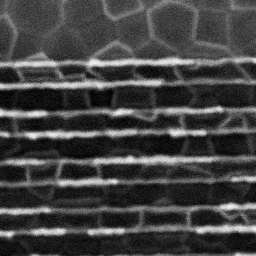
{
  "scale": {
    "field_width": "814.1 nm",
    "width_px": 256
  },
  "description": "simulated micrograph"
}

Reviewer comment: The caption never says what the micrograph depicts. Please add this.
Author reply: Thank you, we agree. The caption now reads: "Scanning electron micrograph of parallel lines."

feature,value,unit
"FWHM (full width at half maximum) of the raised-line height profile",82.8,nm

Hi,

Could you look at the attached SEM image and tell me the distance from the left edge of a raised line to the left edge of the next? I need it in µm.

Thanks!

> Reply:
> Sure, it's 0.156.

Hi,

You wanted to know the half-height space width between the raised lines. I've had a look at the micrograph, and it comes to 74.4 nm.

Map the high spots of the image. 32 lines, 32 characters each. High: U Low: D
DDDDDDDDDDDDDDDDDDDDDDDDDDDDDDDD
DDDDDDDDDDDDDDDDDDDDDDDDDDDDDDDD
DDDDDDDDDDDDDDDDDDDDDDDDDDDDDDDD
DDDDDDDDDDDDDDDDDDDDDDDDDDDDDDDD
DDDDDDDDDDDDDDDDDDDDDDDDDDDDDDDD
DDDDDDDDDDDDDDDDDDDDDDDDDDDDDDDD
DDDDDDDDDDDDDDDDDDDDDDDDDDDDDDDD
DDDDDDDDDDDDDDDUUUDDUUUUUUDUUUUU
UUUUUUUUUUUUUUUUUUUUUUUUUUUUUUUU
UUUUUUUUUUUUUUUUUUUUUUUUUUUUUUUU
UUUUUUUUUUUUUUUUUUUUUUUDDDUDDDDD
DDDDDDDDDDDDDDDDDDDDDDDDDDDDDDDD
DDDDDDDDDDDDDDDDDDDDDDDDDDDDDDDD
DDDDDDDDDDDDDDDDDDDDDUDDDDUUDDDU
UUUUUUUUUUUUUUUUUUUUUUUUUUUUUUUU
UUUUUUUUUUUUUUUUUUUUUUUUUUUUUUUU
UUUUUUUUUUUUUUUUUUUUUUUUUUUUUUUU
DDDDDDDDDDDDDDDDDDDDDDDDDDDDDDDD
DDDDDDDDDDDDDDDDDDDDDDDDDDDDDDDD
DDDDDDDDDDDDDDDDDDDUUDDDDDDDDDDD
UUUUUUUUUUUUUUUUUUUUUUUUUUUUUUUU
UUUUUUUUUUUUUUUUUUUUUUUUUUUUUUUU
UUUUUUUUUUUUUUUUUUUUUUUUUUUUUUUU
DDDDDDDDDDDDDDDDDDDDDDDDDDDDDDDD
DDDDDDDDDDDDDDDDDDDDDDDDDDDDDDDD
DDDDDDDDDDDDDDDDDDDDDDDDDDDDUDDU
UUUUUUUUUUUUUUUUUUUUUUUUUUUUUUUU
UUUUUUUUUUUUUUUUUUUUUUUUUUUUUUUU
UUUUUUUUUUUUUUUUUUUUUUUUUUUUUUUU
UDDDDDDDDDDDDDDDDDDDDDDDDDDDDDDD
DDDDDDDDDDDDDDDDDDDDDDDDDDDDDDDD
DDDDDDDDDDDDDDDDDDDDDDDDDDDDDDDD